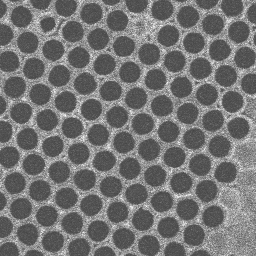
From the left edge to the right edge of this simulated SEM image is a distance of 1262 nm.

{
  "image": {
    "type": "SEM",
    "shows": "a regular array of holes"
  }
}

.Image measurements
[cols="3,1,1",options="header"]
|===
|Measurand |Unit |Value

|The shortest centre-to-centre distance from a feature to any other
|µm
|0.13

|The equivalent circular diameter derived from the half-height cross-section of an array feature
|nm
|104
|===